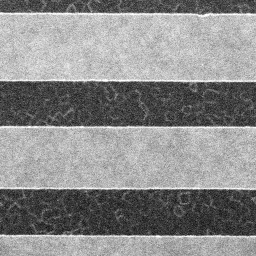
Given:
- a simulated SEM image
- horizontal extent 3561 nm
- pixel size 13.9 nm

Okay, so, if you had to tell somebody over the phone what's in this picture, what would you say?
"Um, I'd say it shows one or a few lines or trenches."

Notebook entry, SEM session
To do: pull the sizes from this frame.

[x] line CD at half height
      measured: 47.6 px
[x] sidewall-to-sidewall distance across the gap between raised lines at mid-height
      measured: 875 nanometres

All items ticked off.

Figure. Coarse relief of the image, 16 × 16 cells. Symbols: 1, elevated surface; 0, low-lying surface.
1111111111111111
0000000000000000
0000000000000000
0000000000000000
0000000000000000
1111111111111111
1111111111111111
1111111111111111
0000000000000000
0000000000000000
0000000000000000
0000000000000000
1111111111111111
1111111111111111
1111111111111111
0000000000000000